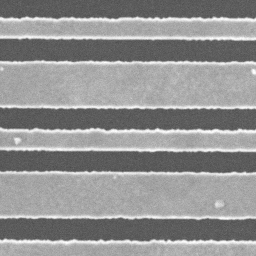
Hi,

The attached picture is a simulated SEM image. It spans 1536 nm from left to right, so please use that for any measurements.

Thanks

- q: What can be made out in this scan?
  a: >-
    lines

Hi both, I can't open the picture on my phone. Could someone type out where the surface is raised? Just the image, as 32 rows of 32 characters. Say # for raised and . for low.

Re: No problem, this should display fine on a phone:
................................
................................
################################
################################
################################
................................
................................
................................
################################
################################
################################
################################
################################
......#####.####################
................................
................................
################################
################################
################################
................................
................................
#########.#.##..................
################################
################################
################################
################################
################################
................................
................................
................................
################################
################################